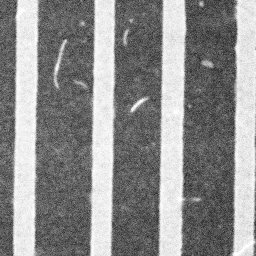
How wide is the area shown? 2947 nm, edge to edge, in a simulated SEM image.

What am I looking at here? one or a few lines or trenches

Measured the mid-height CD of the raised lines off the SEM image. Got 0.211 um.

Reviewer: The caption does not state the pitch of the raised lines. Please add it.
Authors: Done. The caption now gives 845 nanometres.